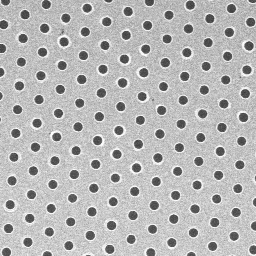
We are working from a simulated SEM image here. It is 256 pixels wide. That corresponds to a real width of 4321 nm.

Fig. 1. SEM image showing a regular array of holes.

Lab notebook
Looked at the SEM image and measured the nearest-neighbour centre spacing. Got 397 nm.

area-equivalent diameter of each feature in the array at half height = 166 nm